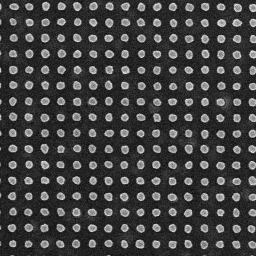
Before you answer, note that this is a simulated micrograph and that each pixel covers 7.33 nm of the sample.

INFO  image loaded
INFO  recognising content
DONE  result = a regular array of raised bodies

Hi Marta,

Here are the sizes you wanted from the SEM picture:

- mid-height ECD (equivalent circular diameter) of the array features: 55.5 nm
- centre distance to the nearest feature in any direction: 113 nm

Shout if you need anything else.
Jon